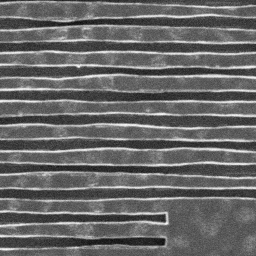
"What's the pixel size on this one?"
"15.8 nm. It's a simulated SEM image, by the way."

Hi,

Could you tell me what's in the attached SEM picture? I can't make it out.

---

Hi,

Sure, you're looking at parallel lines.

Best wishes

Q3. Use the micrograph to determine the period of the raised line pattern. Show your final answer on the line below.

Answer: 386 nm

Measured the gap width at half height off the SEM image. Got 10.6 px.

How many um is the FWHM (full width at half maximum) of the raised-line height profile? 0.224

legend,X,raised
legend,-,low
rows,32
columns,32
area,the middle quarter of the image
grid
---X-------XXXXXXXXXXXXXXXXXXXXX
--------------------------------
--------------------------------
---XXXXXXXXXXXXXXXXXXXXXXXXXXXXX
XXXXXXXXXXXXXXXXXXXXXXXXXXXXXXXX
XXXXXXXXXXXXXXXXXXXXXXXXXXXXXXXX
----------XXXXXXXXXXXXXXXXXXXXXX
--------------------------------
--------------------------------
XXXXXX--------XX--XXXXXXXXXXXXXX
XXXXXXXXXXXXXXXXXXXXXXXXXXXXXXXX
XXXXXXXXXXXXXXXXXXXXXXXXXXXXXXXX
XXXX----------------XXXX--XXXXXX
--------------------------------
--------------------------------
XXXXXXXXXXXXXXXXXXX-------------
XXXXXXXXXXXXXXXXXXXXXXXXXXXXXXXX
XXXXXXXXXXXXXXXXXXXXXXXXXXXXXXXX
----------XXXXXXXXXXXXXXXXXXXXXX
--------------------------------
--------------------------------
-----XXXXXXXXXXXXX---XX--XXXXXXX
XXXXXXXXXXXXXXXXXXXXXXXXXXXXXXXX
XXXXXXXXXXXXXXXXXXXXXXXXXXXXXXXX
XXXXXXXXXXXXXXXXXXXXXXXXXXXXXXXX
--------------------------------
--------------------------------
XXXXXXXXXXXXXXXXX---------------
XXXXXXXXXXXXXXXXXXXXXXXXXXXXXXXX
XXXXXXXXXXXXXXXXXXXXXXXXXXXXXXXX
XXXXXXXXXXXXXXXXXXXXXXXXXXXXXXXX
--------------------------------